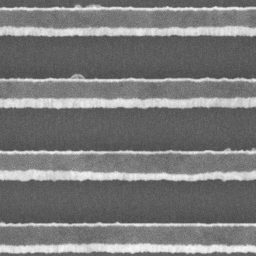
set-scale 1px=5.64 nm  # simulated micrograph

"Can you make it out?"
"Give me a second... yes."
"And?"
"lines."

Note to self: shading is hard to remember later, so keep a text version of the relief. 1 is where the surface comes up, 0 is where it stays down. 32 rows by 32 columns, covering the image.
00000000000000000000000000000000
11111111111111111111111111111111
11111111111111111111111111111111
11111111111111111111111111111111
00000000000000000000000000000000
00000000000000000000000000000000
00000000000000000000000000000000
00000000000000000000000000000000
00000000000000000000000000000000
00000000000000000000000000000000
11111111111111111111111111111111
11111111111111111111111111111111
11111111111111111111111111111111
00000000000000000000000000000000
00000000000000000000000000000000
00000000000000000000000000000000
00000000000000000000000000000000
00000000000000000000000000000000
00000000000000000000000000000000
11111111111111111111111111111111
11111111111111111111111111111111
11111111111111111111111111111111
00000000000000000000000000000000
00000000000000000000000000000000
00000000000000000000000000000000
00000000000000000000000000000000
00000000000000000000000000000000
00000000000000000000000000000000
11111111111111111111111111111111
11111111111111111111111111111111
11111111111111111111111111111111
00000000000000000000000000000000